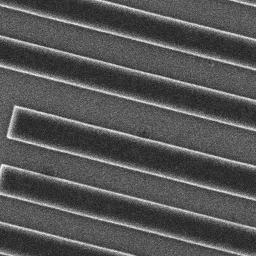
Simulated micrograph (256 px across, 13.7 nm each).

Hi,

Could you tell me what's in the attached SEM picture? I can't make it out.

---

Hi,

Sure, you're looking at parallel lines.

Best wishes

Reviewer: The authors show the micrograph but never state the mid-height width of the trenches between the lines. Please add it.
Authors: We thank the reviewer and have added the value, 414 nm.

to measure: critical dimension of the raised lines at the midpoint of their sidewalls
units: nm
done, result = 400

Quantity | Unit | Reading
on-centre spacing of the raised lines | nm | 842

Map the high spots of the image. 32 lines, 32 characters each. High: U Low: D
UUUUUUUUUUUUUUDDDDDDDDDDDDDDDDDU
DDDUUUUUUUUUUUUUUUDDDDDDDDDDDDDD
DDDDDDDUUUUUUUUUUUUUUUDDDDDDDDDD
DDDDDDDDDDDUUUUUUUUUUUUUUUDDDDDD
DDDDDDDDDDDDDDDUUUUUUUUUUUUUUUDD
UUUUDDDDDDDDDDDDDDDUUUUUUUUUUUUU
UUUUUUUUDDDDDDDDDDDDDDDUUUUUUUUU
UUUUUUUUUUUUDDDDDDDDDDDDDDDUUUUU
DUUUUUUUUUUUUUUUDDDDDDDDDDDDDDDU
DDDDDUUUUUUUUUUUUUUUDDDDDDDDDDDD
DDDDDDDDDUUUUUUUUUUUUUUUDDDDDDDD
DDDDDDDDDDDDDUUUUUUUUUUUUUUUDDDD
DDDDDDDDDDDDDDDDDUUUUUUUUUUUUUUD
DDUDDDDDDDDDDDDDDDDDDUUUUUUUUUUU
DDUUUUUDDDDDDDDDDDDDDDDDDUUUUUUU
DUUUUUUUUUUDDDDDDDDDDDDDDDDDDUUU
DUUUUUUUUUUUUUUDDDDDDDDDDDDDDDDD
DDUUUUUUUUUUUUUUUUDDDDDDDDDDDDDD
DDDDDDUUUUUUUUUUUUUUUUDDDDDDDDDD
DDDDDDDDDDUUUUUUUUUUUUUUUUDDDDDD
DDDDDDDDDDDDDDUUUUUUUUUUUUUUUUDD
UUUUDDDDDDDDDDDDDDUUUUUUUUUUUUUU
UUUUUUUUDDDDDDDDDDDDDDUUUUUUUUUU
UUUUUUUUUUUUDDDDDDDDDDDDDDUUUUUU
DUUUUUUUUUUUUUUUDDDDDDDDDDDDDDUU
DDDDDUUUUUUUUUUUUUUUDDDDDDDDDDDD
DDDDDDDDDUUUUUUUUUUUUUUUDDDDDDDD
DDDDDDDDDDDDDUUUUUUUUUUUUUUUDDDD
UUUDDDDDDDDDDDDDDUUUUUUUUUUUUUUU
UUUUUUUDDDDDDDDDDDDDDUUUUUUUUUUU
UUUUUUUUUUUDDDDDDDDDDDDDDUUUUUUU
UUUUUUUUUUUUUUUDDDDDDDDDDDDDDUUU